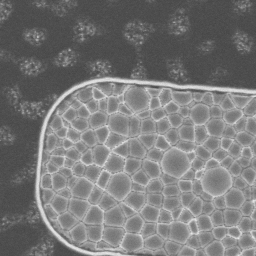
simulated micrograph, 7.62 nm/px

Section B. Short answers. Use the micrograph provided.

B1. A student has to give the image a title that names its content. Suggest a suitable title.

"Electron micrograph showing one or a few lines or trenches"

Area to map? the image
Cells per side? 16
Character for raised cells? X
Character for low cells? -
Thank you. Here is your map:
XXXXXXXXXXXXXXXX
XXXXXXXXXXXXXXXX
XXXXXXXXXXXXXXXX
XXXXXXXXXXXXXXXX
XXXXXXXXXXXXXXXX
XXXXX-------XXXX
XXXX------------
XXX-------------
XXX-------------
XXX-------------
XX--------------
XX-----------X--
XX--------------
XXX-------------
XXX-------------
XXXXX-----------